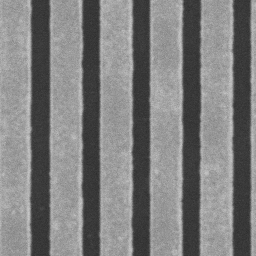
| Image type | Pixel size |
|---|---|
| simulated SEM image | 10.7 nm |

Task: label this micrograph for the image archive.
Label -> lines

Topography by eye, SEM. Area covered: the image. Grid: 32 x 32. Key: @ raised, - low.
@@@@--@@@@---@@@---@@@@--@@@@--@
@@@@--@@@@---@@@---@@@@--@@@@--@
@@@@--@@@@---@@@---@@@@--@@@@--@
@@@@--@@@@---@@@---@@@@--@@@@--@
@@@@--@@@@---@@@---@@@@--@@@@--@
@@@@--@@@@---@@@---@@@@--@@@@--@
@@@@--@@@@---@@@---@@@@--@@@@--@
@@@@--@@@@---@@@---@@@@--@@@@--@
@@@@--@@@@---@@@---@@@@--@@@@--@
@@@@--@@@@---@@@---@@@@--@@@@--@
@@@@--@@@@---@@@---@@@@--@@@@--@
@@@@--@@@@---@@@---@@@@--@@@@--@
@@@@--@@@@---@@@---@@@@--@@@@--@
@@@@--@@@@---@@@---@@@@--@@@@--@
@@@@--@@@@---@@@---@@@@--@@@@--@
@@@@--@@@@---@@@---@@@@--@@@@--@
@@@@--@@@@---@@@---@@@@--@@@@--@
@@@@--@@@@---@@@---@@@@--@@@@--@
@@@@--@@@@---@@@---@@@@--@@@@--@
@@@@--@@@@---@@@---@@@@--@@@@--@
@@@@--@@@@---@@@---@@@@--@@@@--@
@@@@--@@@@---@@@---@@@@--@@@@--@
@@@@--@@@@---@@@---@@@@--@@@@--@
@@@@--@@@@---@@@---@@@@--@@@@--@
@@@---@@@@---@@@---@@@@--@@@@--@
@@@@--@@@@---@@@---@@@---@@@@--@
@@@@--@@@@---@@@---@@@@--@@@@--@
@@@@--@@@@---@@@---@@@@--@@@@--@
@@@@--@@@@---@@@---@@@@--@@@@--@
@@@@--@@@@---@@@---@@@@--@@@@--@
@@@@--@@@@---@@@---@@@@--@@@@--@
@@@@--@@@@---@@@---@@@@--@@@@--@